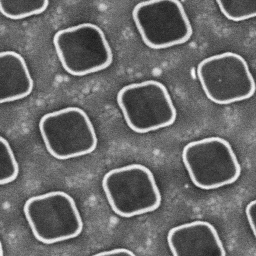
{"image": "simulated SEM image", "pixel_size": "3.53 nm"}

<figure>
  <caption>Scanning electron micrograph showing raised bodies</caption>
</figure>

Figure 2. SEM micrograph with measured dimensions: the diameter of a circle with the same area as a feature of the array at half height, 179 nanometres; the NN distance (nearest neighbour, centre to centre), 293 nm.